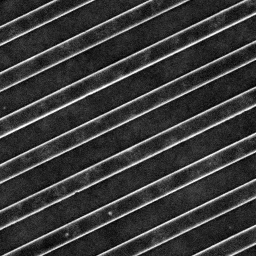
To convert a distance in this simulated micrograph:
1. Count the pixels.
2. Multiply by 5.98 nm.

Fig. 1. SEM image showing parallel lines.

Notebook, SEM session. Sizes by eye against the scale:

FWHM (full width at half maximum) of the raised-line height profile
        103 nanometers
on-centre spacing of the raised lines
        248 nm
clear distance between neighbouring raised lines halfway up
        146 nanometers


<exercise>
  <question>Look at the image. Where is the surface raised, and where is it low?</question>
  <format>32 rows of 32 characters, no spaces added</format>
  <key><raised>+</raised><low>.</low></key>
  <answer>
......+++++.......+++++.......++
....++++........++++........++++
..+++++.......++++........++++..
++++.......+++++.......+++++....
++........++++.......+++++......
.......+++++.......+++++.......+
......++++.......+++++.......+++
...+++++.......+++++.......+++++
.+++++.......+++++.......+++++..
++++.......+++++.......+++++....
++.......+++++.......+++++......
.......+++++.......++++........+
.....+++++.......++++........+++
...+++++.......++++.......+++++.
.+++++.......++++.......+++++...
++++.......++++.......+++++.....
+.......+++++.......+++++.......
......+++++.......+++++.......++
....+++++.......+++++.......++++
..+++++.......+++++.......+++++.
+++++.......+++++.......+++++...
+++.......+++++.......+++++.....
+.......+++++.......+++++.......
......+++++.......+++++.......++
....+++++.......+++++.......++++
..+++++.......+++++.......++++..
+++++.......++++........++++....
++........++++........++++......
........++++.......+++++.......+
.....+++++.......+++++.......+++
...+++++.......+++++.......+++++
.+++++.......+++++.......+++++..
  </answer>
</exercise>